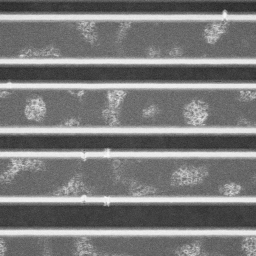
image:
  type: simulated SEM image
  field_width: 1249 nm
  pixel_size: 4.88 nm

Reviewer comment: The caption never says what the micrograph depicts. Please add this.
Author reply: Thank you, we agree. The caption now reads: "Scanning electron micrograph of one or a few lines or trenches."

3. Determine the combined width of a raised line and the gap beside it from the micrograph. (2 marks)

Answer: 336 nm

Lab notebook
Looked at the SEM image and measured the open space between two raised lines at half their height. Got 116 nanometers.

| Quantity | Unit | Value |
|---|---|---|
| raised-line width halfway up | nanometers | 224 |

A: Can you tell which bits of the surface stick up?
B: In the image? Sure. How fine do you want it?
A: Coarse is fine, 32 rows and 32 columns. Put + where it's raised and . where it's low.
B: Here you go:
................................
................................
++++++++++++++++++++++++++++++++
++++++++++++++++++++++++++++++++
++++++++++++++++++++++++++++++++
++++++++++++++++++++++++++++++++
++++++++++++++++++++++++++++++++
++++++++++++++++++++++++++++++++
................................
................................
................................
++++++++++++++++++++++++++++++++
++++++++++++++++++++++++++++++++
++++++++++++++++++++++++++++++++
++++++++++++++++++++++++++++++++
++++++++++++++++++++++++++++++++
................................
................................
................................
++++++++++++++++++++++++++++++++
++++++++++++++++++++++++++++++++
++++++++++++++++++++++++++++++++
++++++++++++++++++++++++++++++++
++++++++++++++++++++++++++++++++
++++++++++++++++++++++++++++++++
................................
................................
................................
................................
++++++++++++++++++++++++++++++++
++++++++++++++++++++++++++++++++
++++++++++++++++++++++++++++++++